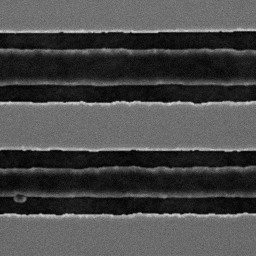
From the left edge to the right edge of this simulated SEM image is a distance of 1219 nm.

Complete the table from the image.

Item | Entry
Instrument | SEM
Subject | lines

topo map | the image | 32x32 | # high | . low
################################
################################
################################
################################
................................
................................
################################
################################
################################
################################
#..........###..............#...
................................
................................
################################
################################
################################
################################
################################
################################
................................
................................
################################
################################
################################
..#..####...####.#########..#.##
................................
................................
################################
################################
################################
################################
################################